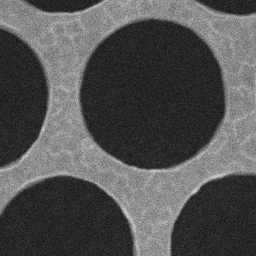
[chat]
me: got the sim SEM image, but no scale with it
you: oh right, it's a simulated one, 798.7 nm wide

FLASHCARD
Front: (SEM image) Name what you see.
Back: holes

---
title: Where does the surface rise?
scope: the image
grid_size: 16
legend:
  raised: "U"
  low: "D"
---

UUDDDDUUUUUUUDDD
UUUUUUUUDDDUUUUU
DUUUUUDDDDDDDUUU
DDUUUUDDDDDDDUUU
DDDUUDDDDDDDDDUU
DDDUUDDDDDDDDDUU
DDDUUDDDDDDDDDUU
DDDUUDDDDDDDDDUU
DDUUUUDDDDDDDUUU
DDUUUUUDDDDDUUUU
UUUUUUUUUDDUUUUU
UUDDDDUUUUUUUDDD
UDDDDDDUUUUUDDDD
DDDDDDDDUUUDDDDD
DDDDDDDDUUUDDDDD
DDDDDDDDUUUDDDDD